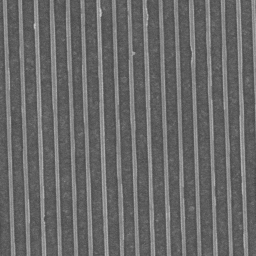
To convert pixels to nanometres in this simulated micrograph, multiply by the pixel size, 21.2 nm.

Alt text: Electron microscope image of parallel lines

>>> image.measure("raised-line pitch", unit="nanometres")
330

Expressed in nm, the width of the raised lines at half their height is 71.7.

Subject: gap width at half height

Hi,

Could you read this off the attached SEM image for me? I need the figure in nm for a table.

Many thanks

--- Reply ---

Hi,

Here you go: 255